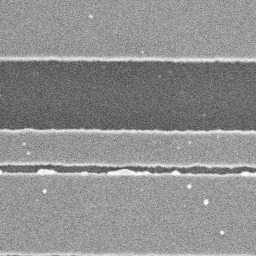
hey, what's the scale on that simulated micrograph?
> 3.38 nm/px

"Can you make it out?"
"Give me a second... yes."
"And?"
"lines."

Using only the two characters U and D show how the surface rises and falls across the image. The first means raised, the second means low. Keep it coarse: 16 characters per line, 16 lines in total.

UUUUUUUUUUUUUUUU
UUUUUUUUUUUUUUUU
UUUUUUUUUUUUUUUU
UUUUUUUUUUUUUUUU
DDDDDDDDDDDDDDDD
DDDDDDDDDDDDDDDD
DDDDDDDDDDDDDDDD
DDDDDDDDDDDDDDDD
UUUUUUUUUUUUUUUU
UUUUUUUUUUUUUUUU
UUUUUUUUUUUUUUUU
UUUUUUUUUUUUUUUU
UUUUUUUUUUUUUUUU
UUUUUUUUUUUUUUUU
UUUUUUUUUUUUUUUU
UUUUUUUUUUUUUUUU